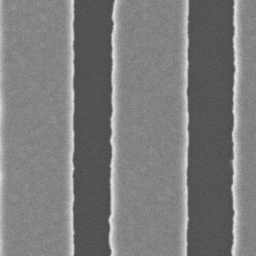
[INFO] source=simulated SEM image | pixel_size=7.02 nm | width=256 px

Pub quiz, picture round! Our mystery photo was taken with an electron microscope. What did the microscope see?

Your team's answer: lines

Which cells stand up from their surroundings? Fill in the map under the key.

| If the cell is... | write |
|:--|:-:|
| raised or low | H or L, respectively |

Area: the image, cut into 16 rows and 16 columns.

HHHHHLLHHHHHLLLH
HHHHHLLHHHHHLLLH
HHHHHLLHHHHHLLLH
HHHHHLLHHHHHLLLH
HHHHHLLHHHHHLLLH
HHHHHLLHHHHHLLLH
HHHHHLLHHHHHLLLH
HHHHHLLHHHHHLLLH
HHHHHLLHHHHHLLLH
HHHHHLLHHHHHLLLH
HHHHHLLHHHHHLLLH
HHHHHLLHHHHHLLLH
HHHHHLLHHHHHLLLH
HHHHHLLHHHHHLLLH
HHHHHLLHHHHHLLLH
HHHHHLLHHHHHLLLH